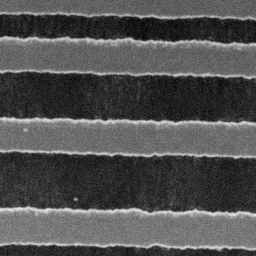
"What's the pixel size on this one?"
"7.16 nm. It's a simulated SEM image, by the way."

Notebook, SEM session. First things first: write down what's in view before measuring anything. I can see lines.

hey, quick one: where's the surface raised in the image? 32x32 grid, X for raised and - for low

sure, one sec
XXXXXXXXXXXXXXXXXXXXXXXXXXXXXXXX
XXXXXXXXXXXXXXXXXXXXXXXXXXXXXXXX
--------------------------------
--------------------------------
--------------------------------
XXXXXXXXXXXXXXXXXXXXXXXXXXXXXXXX
XXXXXXXXXXXXXXXXXXXXXXXXXXXXXXXX
XXXXXXXXXXXXXXXXXXXXXXXXXXXXXXXX
XXXXXXXXXXXXXXXXXXXXXXXXXXXXXXXX
--------------------------XXXXXX
--------------------------------
--------------------------------
--------------------------------
--------------------------------
--------------------------------
XXXXXXXXXXXXXXXXXXXXXXXXXXXXXXXX
XXXXXXXXXXXXXXXXXXXXXXXXXXXXXXXX
XXXXXXXXXXXXXXXXXXXXXXXXXXXXXXXX
XXXXXXXXXXXXXXXXXXXXXXXXXXXXXXXX
------------------X-----XXXXXXXX
--------------------------------
--------------------------------
--------------------------------
--------------------------------
--------------------------------
--------------------------------
XXXXXXXXXXXXXXXXXX-XXX-XXX------
XXXXXXXXXXXXXXXXXXXXXXXXXXXXXXXX
XXXXXXXXXXXXXXXXXXXXXXXXXXXXXXXX
XXXXXXXXXXXXXXXXXXXXXXXXXXXXXXXX
XXXXXXXXXXXXXXXXXXXXXXXXXXXXXXXX
--------------------------------